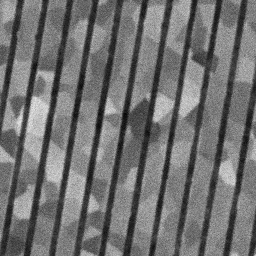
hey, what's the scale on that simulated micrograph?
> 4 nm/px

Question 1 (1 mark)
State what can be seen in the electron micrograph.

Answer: parallel lines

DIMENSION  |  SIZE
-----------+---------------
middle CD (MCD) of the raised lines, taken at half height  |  69.9 nm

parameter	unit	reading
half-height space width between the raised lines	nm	28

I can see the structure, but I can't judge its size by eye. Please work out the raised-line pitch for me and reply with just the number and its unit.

98.1 nanometres